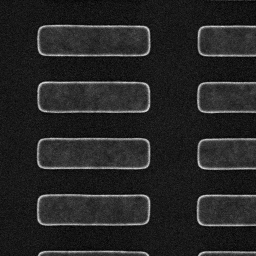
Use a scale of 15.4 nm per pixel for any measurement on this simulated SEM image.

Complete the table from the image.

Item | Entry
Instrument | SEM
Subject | groups of lines, slits or small figures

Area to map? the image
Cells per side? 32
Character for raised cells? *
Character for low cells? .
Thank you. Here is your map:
................................
................................
................................
.....*************.......*******
.....**************......*******
.....**************......*******
.....**************......*******
................................
................................
................................
.....*************.......*******
.....**************......*******
.....**************......*******
.....**************......*******
................................
................................
................................
.....*************.......*******
.....**************......*******
.....**************......*******
.....**************......*******
................................
................................
................................
.....*************.......*******
.....**************......*******
.....**************......*******
.....**************......*******
................................
................................
................................
.....***********..........***...